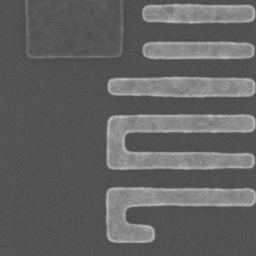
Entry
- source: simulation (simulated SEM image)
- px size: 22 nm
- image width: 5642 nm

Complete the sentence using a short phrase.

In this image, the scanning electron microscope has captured wiring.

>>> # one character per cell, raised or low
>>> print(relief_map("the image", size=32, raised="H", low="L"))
LLLHHHHHHHHHHHHLLLLLLLLLLLLLLLLL
LLLHHHHHHHHHHHHLLLHHHHHHHHHHHHHH
LLLHHHHHHHHHHHHLLLHHHHHHHHHHHHHL
LLLHHHHHHHHHHHHLLLLLLLLLLLLLLLLL
LLLHHHHHHHHHHHHLLLLLLLLLLLLLLLLL
LLLHHHHHHHHHHHHLLLHHHHHHHHHHHHHL
LLLHHHHHHHHHHHHLLLHHHHHHHHHHHHHH
LLLLLLLLLLLLLLLLLLLLLLLLLLLLLLLL
LLLLLLLLLLLLLLLLLLLLLLLLLLLLLLLL
LLLLLLLLLLLLLLLLLLLLLLLLLLLLLLLL
LLLLLLLLLLLLLLHHHHHHHHHHHHHHHHHH
LLLLLLLLLLLLLLHHHHHHHHHHHHHHHHHH
LLLLLLLLLLLLLLLLLLLLLLLLLLLLLLLL
LLLLLLLLLLLLLLLLLLLLLLLLLLLLLLLL
LLLLLLLLLLLLLLHHHHHHHHHHHHHHHHHL
LLLLLLLLLLLLLLHHHHHHHHHHHHHHHHHH
LLLLLLLLLLLLLHHHHHHHHHLHHHHHLLHL
LLLLLLLLLLLLLHHHLLLLLLLLLLLLLLLL
LLLLLLLLLLLLLHHHLLLLLLLLLLLLLLLL
LLLLLLLLLLLLLHHHHHHHHHHHHHHHHHHH
LLLLLLLLLLLLLHHHHHHHHHHHHHHHHHHH
LLLLLLLLLLLLLLLLLLLLLLLLLLLLLLLL
LLLLLLLLLLLLLLLLLLLLLLLLLLLLLLLL
LLLLLLLLLLLLLLHHHHLLLLLLLLLLLLLL
LLLLLLLLLLLLLHHHHHHHHHHHHHHHHHHH
LLLLLLLLLLLLLHHHHHHHHHHHHHHHHHHH
LLLLLLLLLLLLLHHHLLLLLLLLLLLLLLLL
LLLLLLLLLLLLLHHHLLLLLLLLLLLLLLLL
LLLLLLLLLLLLLHHHHHHLLLLLLLLLLLLL
LLLLLLLLLLLLLHHHHHHLLLLLLLLLLLLL
LLLLLLLLLLLLLLLLLLLLLLLLLLLLLLLL
LLLLLLLLLLLLLLLLLLLLLLLLLLLLLLLL